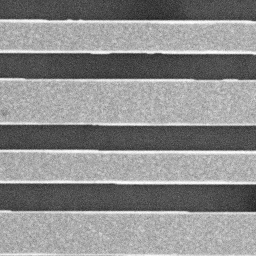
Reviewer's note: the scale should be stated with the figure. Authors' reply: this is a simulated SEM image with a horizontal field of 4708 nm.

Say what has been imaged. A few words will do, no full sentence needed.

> lines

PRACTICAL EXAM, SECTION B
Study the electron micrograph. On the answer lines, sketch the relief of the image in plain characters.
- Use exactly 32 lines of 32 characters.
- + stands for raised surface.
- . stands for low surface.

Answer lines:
................................
................................
................................
++++++++++++++++++++++++++++++++
++++++++++++++++++++++++++++++++
++++++++++++++++++++++++++++++++
++++++++++++++++++++++++++++++++
................................
................................
................................
++++++++++++++++++++++++++++++++
++++++++++++++++++++++++++++++++
++++++++++++++++++++++++++++++++
++++++++++++++++++++++++++++++++
++++++++++++++++++++++++++++++++
.............+++++++++++++++++++
................................
................................
................................
++++++++++++++++++++++++++++++++
++++++++++++++++++++++++++++++++
++++++++++++++++++++++++++++++++
++++++++++++++++++++++++++++++++
................................
................................
................................
................................
++++++++++++++++++++++++++++++++
++++++++++++++++++++++++++++++++
++++++++++++++++++++++++++++++++
++++++++++++++++++++++++++++++++
++++++++++++++++++++++++++++++++